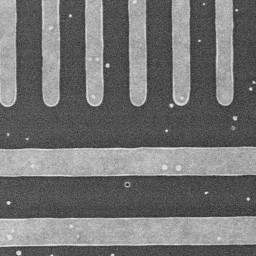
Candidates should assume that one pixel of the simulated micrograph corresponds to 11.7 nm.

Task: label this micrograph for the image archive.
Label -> groups of lines, slits or small figures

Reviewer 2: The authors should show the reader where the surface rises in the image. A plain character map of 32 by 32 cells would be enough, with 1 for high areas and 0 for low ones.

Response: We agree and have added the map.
11000110000110001100001100011000
11000110000110001100001100011000
11000110000110001100001100011000
11000110000110001100001100011000
11000110000110001100001100011000
11000110000110001100001100011000
11000110000110001100001100011000
11000110000110001100001100011000
11000110000110001100001100011000
11000110000110001100001100011000
11000110000110001100001100011000
11000110000110001100001100011000
11000110000110001100001000011000
00000000000000000000000000000000
00000000000000000000000000000000
00000000000000000000000000000000
00000000000000000000000000000000
00000000000000000000000000000000
00000000000000000000000000000111
11111111111111111111111111111111
11111111111111111111111111111111
11111111111111111111111111111111
00000000000000000000000000000000
00000000000000000000000000000000
00000000000000000000000000000000
00000000000000000000000000000000
00000000000000000000000000000000
11111111111111111111111111111111
11111111111111111111111111111111
11111111111111111111111111111111
11111111111111111111111111111000
00000000000000000000000000000000